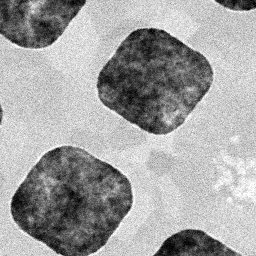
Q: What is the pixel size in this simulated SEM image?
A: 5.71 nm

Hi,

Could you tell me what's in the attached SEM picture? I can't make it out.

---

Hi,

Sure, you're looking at holes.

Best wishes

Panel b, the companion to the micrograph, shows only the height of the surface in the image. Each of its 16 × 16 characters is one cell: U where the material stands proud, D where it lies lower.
DDDDDUUUUUUUUUDD
DDDDUUUUUUUUUUUU
UDDDUUUUDDDUUUUU
UUUUUUUDDDDDDUUU
UUUUUUDDDDDDDUUU
UUUUUUDDDDDDDUUU
UUUUUUDDDDDDUUUU
UUUUUUUUDDDDUUUU
UUUUUUUUUUUUUUUU
UUUDDDUUUUUUUUUU
UUDDDDDUUUUUUUUU
UDDDDDDDUUUUUUUU
UDDDDDDDUUUUUUUU
UDDDDDDDUUUUUUUU
UDDDDDDUUUUDDUUU
UUUDDDUUUUDDDDUU